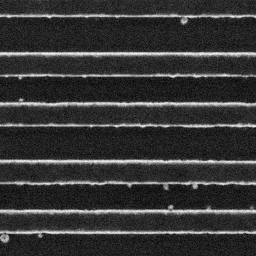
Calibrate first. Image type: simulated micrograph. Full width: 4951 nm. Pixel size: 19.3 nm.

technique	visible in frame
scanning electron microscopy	lines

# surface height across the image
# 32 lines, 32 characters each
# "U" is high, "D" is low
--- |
UUUUUUUUUUUUUUUUUUUUUUUUUUUUUUUU
UUUUUUUUUUUUUUUUUUUUUUUUUUUUUUUU
DDDDDDDDDDDDDDDDDDDDDDDDDDDDDDDD
DDDDDDDDDDDDDDDDDDDDDDDDDDDDDDDD
DDDDDDDDDDDDDDDDDDDDDDDDDDDDDDDD
DDDDDDDDDDDDDDDDDDDDDDDDDDDDDDDD
DDDDDDDDDDDDDDDDDDDDDDDDDDDDDDDD
UUUUUUUUUUUUUUUUUUUUUUUUUUUUUUUU
UUUUUUUUUUUUUUUUUUUUUUUUUUUUUUUU
DDDDDDDDDDUDDDDDDDDDDUDDDDDDDDUD
DDDDDDDDDDDDDDDDDDDDDDDDDDDDDDDD
DDDDDDDDDDDDDDDDDDDDDDDDDDDDDDDD
DDDDDDDDDDDDDDDDDDDDDDDDDDDDDDDD
UUUUUUUUUUUUUUUUUUUUUUUUUUUUUUUU
UUUUUUUUUUUUUUUUUUUUUUUUUUUUUUUU
UUUUUUUUUUUUUUUUUUUUUUUUUUUUUUUU
DDDDDDDDDDDDDDDDDDDDDDDDDDDDDDDD
DDDDDDDDDDDDDDDDDDDDDDDDDDDDDDDD
DDDDDDDDDDDDDDDDDDDDDDDDDDDDDDDD
DDDDDDDDDDDDDDDDDDDDDDDDDDDDDDDD
UUUUUUUUUUUUUUUUUUUUUUUUUUUUUUUU
UUUUUUUUUUUUUUUUUUUUUUUUUUUUUUUU
UUUUUUUUUUUUUUUUUUUUUUUUUUUUUUUU
DDDDDDDDDDDDDDDDDDDDDDDDDDDDDDDD
DDDDDDDDDDDDDDDDDDDDDDDDDDDDDDDD
DDDDDDDDDDDDDDDDDDDDDDDDDDDDDDDD
UUUUUUUUUUUUUUUUUUUUUUUUUUUUUUUU
UUUUUUUUUUUUUUUUUUUUUUUUUUUUUUUU
UUUUUUUUUUUUUUUUUUUUUUUUUUUUUUUU
DDDDDDDDDDDDDDDDDDDDDDDDDDDDDDDD
DDDDDDDDDDDDDDDDDDDDDDDDDDDDDDDD
DDDDDDDDDDDDDDDDDDDDDDDDDDDDDDDD